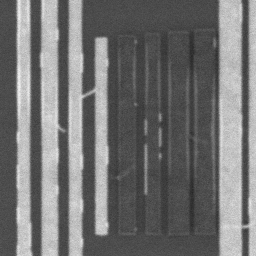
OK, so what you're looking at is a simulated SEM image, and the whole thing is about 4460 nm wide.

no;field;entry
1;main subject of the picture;groups of lines, slits or small figures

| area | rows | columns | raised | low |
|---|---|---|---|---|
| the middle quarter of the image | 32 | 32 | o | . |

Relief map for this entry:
.ooo....ooo...ooo....ooo...oooo.
.ooo....ooo...ooo....ooo...oooo.
.ooo....ooo...ooo....ooo...oooo.
.ooo....ooo...ooo....ooo...oooo.
.ooo....oo....ooo....ooo...oooo.
..oo....oo....ooo....ooo...oooo.
..oo....ooo...ooo....ooo...oooo.
..oo....ooo...ooo....ooo...oooo.
..ooo...ooo...oooo...ooo...oooo.
..oo....ooo...oooo...ooo...oooo.
..oo....ooo...oooo...ooo...oooo.
..oo....ooo...oooo...ooo...oooo.
..oo....ooo...oooo...ooo...oooo.
..oo....ooo...oooo...ooo...oooo.
..oo....ooo...oooo...ooo...oooo.
..oo....ooo...oooo...ooo...oooo.
..oo....ooo...oooo...ooo...oooo.
..oo....ooo...oooo...ooo...oooo.
..oo....ooo...oooo...ooo...oooo.
..oo....ooo...oooo...ooo...oooo.
..oo....ooo...oooo...ooo...oooo.
.ooo....ooo...oooo...ooo...oooo.
.ooo....ooo...oooo...ooo...oooo.
.ooo....ooo...oooo...ooo...oooo.
.ooo....ooo...oooo...ooo...oooo.
..oo....ooo...oooo...ooo...oooo.
..oo....ooo...oooo...ooo...oooo.
..oo....ooo...oooo...ooo...oooo.
..oo....ooo...oooo...ooo..ooooo.
..oo....ooo...oooo...ooo..ooooo.
..oo....ooo...oooo...ooo..ooooo.
..oo....ooo...oooo...ooo..ooooo.